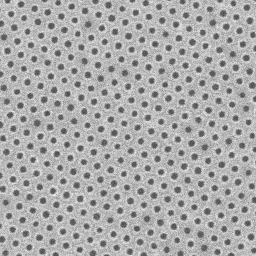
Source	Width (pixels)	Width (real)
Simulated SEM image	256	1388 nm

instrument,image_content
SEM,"a regular array of holes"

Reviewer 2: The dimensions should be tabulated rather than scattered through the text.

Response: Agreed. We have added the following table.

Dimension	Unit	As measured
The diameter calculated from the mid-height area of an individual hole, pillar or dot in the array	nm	36.2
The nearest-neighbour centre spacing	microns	0.0741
